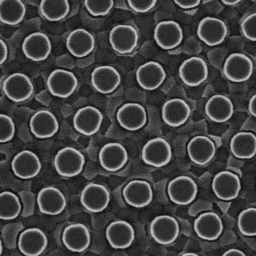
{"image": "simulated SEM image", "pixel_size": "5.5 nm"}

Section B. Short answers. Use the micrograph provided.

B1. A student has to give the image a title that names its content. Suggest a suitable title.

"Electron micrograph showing a regular array of raised bodies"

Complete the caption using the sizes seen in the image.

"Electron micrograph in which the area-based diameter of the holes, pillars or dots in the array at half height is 145 nm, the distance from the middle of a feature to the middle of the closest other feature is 0.24 µm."